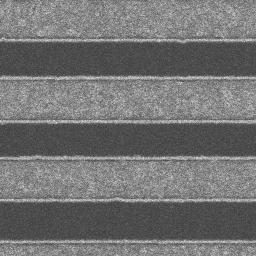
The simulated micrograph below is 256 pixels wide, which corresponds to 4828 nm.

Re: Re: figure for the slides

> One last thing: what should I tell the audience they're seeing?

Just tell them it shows one or a few lines or trenches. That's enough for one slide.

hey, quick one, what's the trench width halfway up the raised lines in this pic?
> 802 nm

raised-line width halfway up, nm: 722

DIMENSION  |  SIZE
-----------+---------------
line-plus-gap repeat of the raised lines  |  1530 nanometres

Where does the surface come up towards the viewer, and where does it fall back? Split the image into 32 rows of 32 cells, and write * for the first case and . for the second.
................................
................................
................................
................................
................................
********************************
********************************
********************************
********************************
********************************
................................
................................
................................
................................
................................
********************************
********************************
********************************
********************************
********************************
................................
................................
................................
................................
................................
********************************
********************************
********************************
********************************
********************************
................................
................................